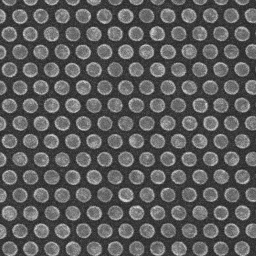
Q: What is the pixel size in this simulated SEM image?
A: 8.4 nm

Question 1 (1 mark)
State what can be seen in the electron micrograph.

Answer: a regular array of raised bodies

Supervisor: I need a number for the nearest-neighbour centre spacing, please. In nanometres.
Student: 173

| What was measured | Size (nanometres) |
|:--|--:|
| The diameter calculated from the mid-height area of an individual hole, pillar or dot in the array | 121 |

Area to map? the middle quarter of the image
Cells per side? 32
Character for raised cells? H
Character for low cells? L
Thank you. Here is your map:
LHHLLLHHHLLHHHLLLHHHLLHHHLLHHHLL
LHHHLLHHHLLHHHLLHHHHLLHHHLLHHHLL
LHHHLLHHHLLHHHLLLHHLLLHHHLLHHHLL
LLLLLLLLLLLLLLLLLLLLLLLLLLLLLLLL
LLLLHHLLLHHLLLHHLLLHHHLLLHHLLLHH
HLLHHHLLHHHHLLHHHLLHHHLLHHHHLLHH
HLLHHHLLLHHHLLHHHLLHHHLLHHHHLLHH
LLLLHHLLLHHLLLLHLLLLHHLLLHHLLLLL
LLLLLLLLLLLLLLLLLLLLLLLLLLLLLLLL
LHHHLLHHHLLHHHLLLHHHLLHHHLLHHHLL
LHHHLLHHHLLHHHLLHHHHLLHHHLLHHHLL
LHHHLLHHHLLLHHLLLHHLLLHHHLLHHHLL
LLLLLLLLLLLLLLLLLLLLLLLLLLLLLLLL
HLLLHHLLLHHLLLHHLLLHHHLLLHHLLLHH
HLLHHHLLLHHHLLHHHLLHHHLLHHHHLLHH
HLLHHHLLLHHHLLHHHLLHHHLLHHHHLLHH
LLLLLHLLLLHLLLLHLLLLLLLLLLLLLLLH
LLLLLLLLLLLLLLLLLLLLLLLLLLLLLLLL
LHHHLLHHHLLHHHLLLHHHLLHHHLLHHHLL
LHHHLLHHHLLHHHLLLHHHLLHHHLLHHHLL
LHHHLLHHHLLLHHLLLHHLLLHHHLLLHHLL
LLLLLLLLLLLLLLLLLLLLLLLLLLLLLLLL
HLLLHHLLLHHLLLHHHLLLHHLLLHHLLLHH
HLLHHHHLHHHHLLHHHLLHHHHLHHHHLLHH
HLLHHHHLLHHHLLHHHLLHHHLLHHHHLLHH
LLLLLLLLLLLLLLLLLLLLLLLLLLLLLLLL
LLLLLLLLLLLLLLLLLLLLLLLLLLLLLLLL
LHHHLLHHHLLHHHLLLHHHLLHHHLLHHHLL
LHHHLLHHHLLHHHLLLHHHLLHHHLLHHHLL
LHHHLLHHHLLLHHLLLHHLLLLHHLLLHHLL
LLLLLLLLLLLLLLLLLLLLLLLLLLLLLLLL
HLLLHHLLLHHLLLHHHLLHHHLLLHHLLLHH